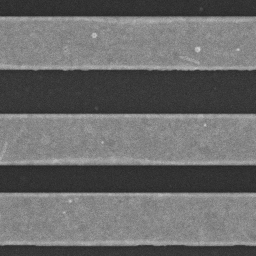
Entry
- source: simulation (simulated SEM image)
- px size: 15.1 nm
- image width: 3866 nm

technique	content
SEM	lines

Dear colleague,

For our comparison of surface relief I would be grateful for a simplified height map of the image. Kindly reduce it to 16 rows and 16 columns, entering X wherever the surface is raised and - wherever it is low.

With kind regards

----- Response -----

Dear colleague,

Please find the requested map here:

----------------
XXXXXXXXXXXXXXXX
XXXXXXXXXXXXXXXX
XXXXXXXXXXXXXXXX
----------------
----------------
----------------
XXXXXXXXXXXXXXXX
XXXXXXXXXXXXXXXX
XXXXXXXXXXXXXXXX
----------------
----------------
XXXXXXXXXXXXXXXX
XXXXXXXXXXXXXXXX
XXXXXXXXXXXXXXXX
----------------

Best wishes